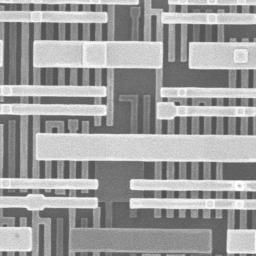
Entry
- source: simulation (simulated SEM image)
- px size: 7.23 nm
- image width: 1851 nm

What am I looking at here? wiring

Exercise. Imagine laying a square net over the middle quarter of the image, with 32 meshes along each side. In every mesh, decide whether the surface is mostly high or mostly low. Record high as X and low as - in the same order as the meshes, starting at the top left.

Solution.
XXXXXXXXXXXXXXXXXXXXXXXX-------X
--------------------------------
--------------------------------
--------------------------------
--------------------------------
--------------------------------
XXXXXXXXXX--------------XXXXXXXX
XXXXXXXXXX--------------XXXXXXXX
--------------------------------
--------------------------------
XXXXXXXXXX-------------XXXXX----
XXXXXXXXXX-------------XXXXXXXXX
XXXXXXXXXX-------------XXXXXXXXX
-----------------------XXXX-----
--------------------------------
--------------------------------
--------------------------------
--------------------------------
XXXXXXXXXXXXXXXXXXXXXXXXXXXXXXXX
XXXXXXXXXXXXXXXXXXXXXXXXXXXXXXXX
XXXXXXXXXXXXXXXXXXXXXXXXXXXXXXXX
XXXXXXXXXXXXXXXXXXXXXXXXXXXXXXXX
XXXXXXXXXXXXXXXXXXXXXXXXXXXXXXXX
XXXXXXXXXXXXXXXXXXXXXXXXXXXXXXXX
--------------------------------
--------------------------------
--------------------------------
--------------------------------
--------------------------------
XXXXXXXX---------XXXXXXXXXXXXXXX
XXXXXXXX---------XXXXXXXXXXXXXXX
--------------------------------